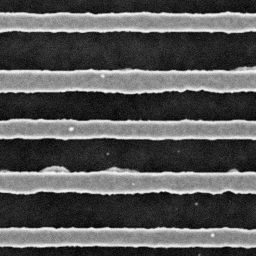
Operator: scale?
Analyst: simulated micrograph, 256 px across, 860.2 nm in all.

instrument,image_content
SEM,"lines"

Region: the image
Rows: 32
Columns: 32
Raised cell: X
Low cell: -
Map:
--------------------------------
--------------------------------
XXXXXXXXXXXXXXXXXXXXXXXXXXXXXXXX
XXXXXXXXXXXXXXXXXXXXXXXXXXXXXXXX
--------------------------------
--------------------------------
--------------------------------
--------------------------------
--------------------------------
XXXXXXXXXXXXXXXXXXXXXXXXXXXXXXXX
XXXXXXXXXXXXXXXXXXXXXXXXXXXXXXXX
XXXXX--------XXXXXXX-------XXX--
--------------------------------
--------------------------------
--------------------------------
XXXXXXXXXXXXXXXXXXXXXXXXXXXXXXXX
XXXXXXXXXXXXXXXXXXXXXXXXXXXXXXXX
--------------------------------
--------------------------------
--------------------------------
--------------------------------
------------XX------------------
XXXXXXXXXXXXXXXXXXXXXXXXXXXXXXXX
XXXXXXXXXXXXXXXXXXXXXXXXXXXXXXXX
--------------------------------
--------------------------------
--------------------------------
--------------------------------
-XX--XX-XX-X-X-X----X------XX---
XXXXXXXXXXXXXXXXXXXXXXXXXXXXXXXX
XXXXXXXXXXXXXXXXXXXXXXXXXXXXXXXX
--------------------------------